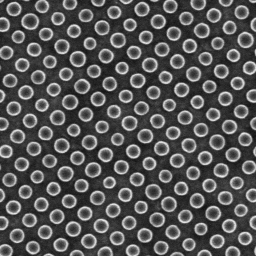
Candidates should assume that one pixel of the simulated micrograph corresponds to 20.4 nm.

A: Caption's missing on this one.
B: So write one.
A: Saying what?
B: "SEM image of a regular array of raised bodies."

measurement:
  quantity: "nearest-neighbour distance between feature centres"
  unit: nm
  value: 397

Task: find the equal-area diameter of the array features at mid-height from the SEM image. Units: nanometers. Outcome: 272